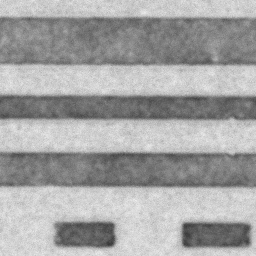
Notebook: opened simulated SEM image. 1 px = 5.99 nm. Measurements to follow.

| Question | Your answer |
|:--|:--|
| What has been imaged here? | one or a few lines or trenches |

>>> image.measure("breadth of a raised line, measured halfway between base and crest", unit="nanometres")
188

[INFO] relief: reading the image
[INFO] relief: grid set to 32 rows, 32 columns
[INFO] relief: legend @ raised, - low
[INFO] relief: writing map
@@@@@@@@@@@@@@@@@@@@@@@@@@@@@@@@
@@@@@@@@@@@@@@@@@@@@@@@@@@@@@@@@
--------------------------------
--------------------------------
--------------------------------
--------------------------------
--------------------------------
--------------------------------
@@@@@@@@@@@@@@@@@@@@@@@@@@@@@@@@
@@@@@@@@@@@@@@@@@@@@@@@@@@@@@@@@
@@@@@@@@@@@@@@@@@@@@@@@@@@@@@@@@
@@@@@@@@@@@@@@@@@@@@@@@@@@@@@@@@
--------------------------------
--------------------------------
--------------------------------
@@@@@@@@@@@@@@@@@@@@@@@@@@@@@@@@
@@@@@@@@@@@@@@@@@@@@@@@@@@@@@@@@
@@@@@@@@@@@@@@@@@@@@@@@@@@@@@@@@
@@@@@@@@@@@@@@@@@@@@@@@@@@@@@@@@
--------------------------------
--------------------------------
--------------------------------
--------------------------------
-----@@@------------------------
@@@@@@@@@@@@@@@@@@@@@@@@@@@@@@@@
@@@@@@@@@@@@@@@@@@@@@@@@@@@@@@@@
@@@@@@@@@@@@@@@@@@@@@@@@@@@@@@@@
@@@@@@@@@@@@@@@@@@@@@@@@@@@@@@@@
@@@@@@@-------@@@@@@@@@---------
@@@@@@@--------@@@@@@@@---------
@@@@@@@-------@@@@@@@@@---------
@@@@@@@@@@@@@@@@@@@@@@@@@@@@@@@@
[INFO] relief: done